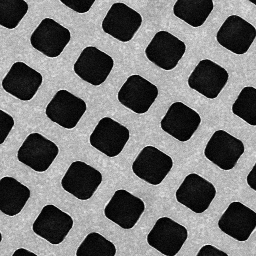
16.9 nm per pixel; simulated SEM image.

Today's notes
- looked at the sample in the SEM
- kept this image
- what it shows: a regular array of holes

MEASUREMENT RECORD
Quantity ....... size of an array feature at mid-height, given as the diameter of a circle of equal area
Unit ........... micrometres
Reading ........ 0.628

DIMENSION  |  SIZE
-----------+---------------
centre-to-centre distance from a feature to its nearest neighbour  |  51.6 pixels